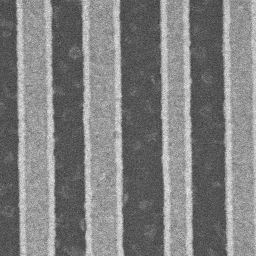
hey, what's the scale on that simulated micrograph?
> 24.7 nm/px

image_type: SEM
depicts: one or a few lines or trenches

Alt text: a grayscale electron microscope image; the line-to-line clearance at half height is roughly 1010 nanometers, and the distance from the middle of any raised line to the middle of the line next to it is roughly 1730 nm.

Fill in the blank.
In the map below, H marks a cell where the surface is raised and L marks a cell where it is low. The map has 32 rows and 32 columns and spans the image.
LLHHHHLLLLLHHHHLLLLLHHHLLLLLHHHH
LLLHHHLLLLLHHHHLLLLLHHHLLLLLHHHH
LLLHHHLLLLLHHHHLLLLLHHHLLLLLHHHH
LLLHHHLLLLLHHHHLLLLLHHHLLLLLHHHH
LLLHHHLLLLLHHHHLLLLLHHHLLLLLHHHH
LLHHHHLLLLLHHHHLLLLLHHHLLLLLHHHH
LLHHHHLLLLLHHHHLLLLLHHHLLLLLHHHH
LLLHHHLLLLLHHHHLLLLLHHHLLLLLHHHH
LLLHHHLLLLLHHHHLLLLLLHHLLLLLHHHH
LLLHHHLLLLLHHHHLLLLLLHHLLLLLHHHH
LLLHHHLLLLLHHHHLLLLLLHHLLLLLHHHH
LLLHHHLLLLLHHHHLLLLLLHHLLLLLHHHH
LLLHHHLLLLLHHHHLLLLLLHHLLLLLHHHH
LLLHHHLLLLLHHHHLLLLLLHHLLLLLLHHH
LLLHHHLLLLLHHHHLLLLLLHHLLLLLLHHH
LLLHHHLLLLLHHHHLLLLLLHHHLLLLLHHH
LLLHHHLLLLLHHHHLLLLLLHHLLLLLLHHH
LLLHHHLLLLLHHHHLLLLLLHHLLLLLLHHH
LLLHHHLLLLLHHHHLLLLLLHHHLLLLLHHH
LLLHHHLLLLLHHHHLLLLLLHHHLLLLLHHH
LLLHHHLLLLLHHHHLLLLLLHHHLLLLLHHH
LLLHHHLLLLLHHHHLLLLLLHHHLLLLLHHH
LLLHHHLLLLLHHHHLLLLLLHHHLLLLLHHH
LLLHHHLLLLLHHHHLLLLLLHHHLLLLLHHH
LLLHHHHLLLLHHHHLLLLLLHHHLLLLLHHH
LLLHHHLLLLLHHHHLLLLLLHHHLLLLLHHH
LLLHHHLLLLLHHHHLLLLLLHHHLLLLLHHH
LLLHHHHLLLLHHHHLLLLLLHHHLLLLLHHH
LLLHHHLLLLLHHHHLLLLLLHHHLLLLLHHH
LLLHHHLLLLLHHHHLLLLLLHHHLLLLLHHH
LLLHHHLLLLLHHHHLLLLLLHHHLLLLLHHH
LLLHHHLLLLLHHHHLLLLLLHHHLLLLLHHH